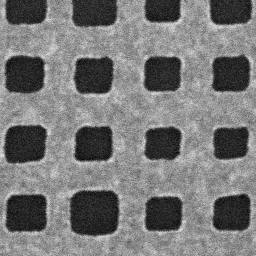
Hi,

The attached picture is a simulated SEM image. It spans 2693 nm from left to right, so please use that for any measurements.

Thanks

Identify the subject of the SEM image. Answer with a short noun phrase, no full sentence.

a regular array of holes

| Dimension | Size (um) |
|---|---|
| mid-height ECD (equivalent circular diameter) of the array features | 0.433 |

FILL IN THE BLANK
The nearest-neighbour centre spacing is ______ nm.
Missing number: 718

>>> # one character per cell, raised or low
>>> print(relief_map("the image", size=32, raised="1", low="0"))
10000011100000011100000111000000
10000011100000011100000111000000
10000011100000011100001111000001
11111111110111111111111111111111
11111111111111111111111111111111
11111111111111111111111111111111
11111111111111111111111111111111
10000111110000111100000111100001
10000011100000111100000111000001
10000011100000111100000111100001
10000011100000111100000111000001
10000111110000111110001111100011
11111111111111111111111111111111
11111111111111111111111111111111
11111111111111111111111111111111
11110111111111111111111111111111
10000011110000111100000111100001
00000011100000111100000111100001
00000011100000111100000111100001
10000011100000111100001111100001
10011111111111111111111111111111
11111111111111111111111111111111
11111111111111011111111111111111
11111111111111111111111111111111
10000111100000011111001111110001
10000011100000011100000111100001
10000011100000011100000111000001
10000011100000011100000111000001
10000011100000011100001111100001
11111111111001111111111111111111
11111111111111111111111111111111
11111111111111111111111111111111